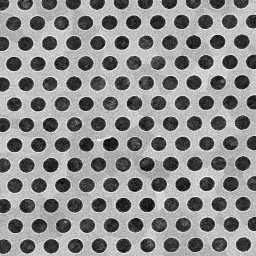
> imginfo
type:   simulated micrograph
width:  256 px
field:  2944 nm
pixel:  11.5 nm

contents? a regular array of holes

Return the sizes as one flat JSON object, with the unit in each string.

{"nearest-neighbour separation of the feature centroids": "269 nm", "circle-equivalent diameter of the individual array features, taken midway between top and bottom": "176 nm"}